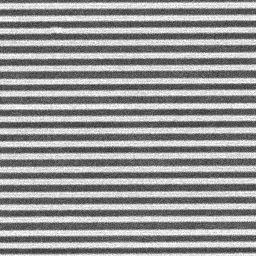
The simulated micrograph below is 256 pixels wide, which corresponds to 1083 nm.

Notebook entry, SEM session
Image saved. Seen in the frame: parallel lines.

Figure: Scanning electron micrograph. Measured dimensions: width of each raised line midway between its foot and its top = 21.7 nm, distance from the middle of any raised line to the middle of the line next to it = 53.3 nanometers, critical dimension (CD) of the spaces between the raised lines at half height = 32.8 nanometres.